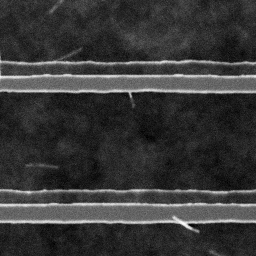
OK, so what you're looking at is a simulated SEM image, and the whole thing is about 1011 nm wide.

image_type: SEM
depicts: lines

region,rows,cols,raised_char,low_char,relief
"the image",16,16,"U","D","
DDDDDDDDDDDDDDDD
DDDDDDDDDDDDDDDD
DDDDDDDDDDDDDDDD
DDDDDDDDDDDDDDDD
UUUUUUUUUUUUUUUU
UUUUUUUUUUUUUUUU
DDDDDDDDDDDDDDDD
DDDDDDDDDDDDDDDD
DDDDDDDDDDDDDDDD
DDDDDDDDDDDDDDDD
DDDDDDDDDDDDDDDD
DDDDDDDDDDDDDDDD
UUUUUUUUUUUUUUUU
UUUUUUUUUUUUUUUU
DDDDDDDDDDDDDDDD
DDDDDDDDDDDDDDDD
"